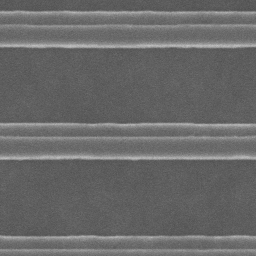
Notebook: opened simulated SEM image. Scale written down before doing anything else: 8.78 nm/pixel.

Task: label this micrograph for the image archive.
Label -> lines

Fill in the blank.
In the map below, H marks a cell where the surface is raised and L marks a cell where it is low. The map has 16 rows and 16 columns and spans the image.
LLLLLLLLLLLLLLLL
HHHHHHHHHHHHHHHH
HHHHHHHHHHHHHHHH
LLLLLLLLLLLLLLLL
LLLLLLLLLLLLLLLL
LLLLLLLLLLLLLLLL
LLLLLLLLLLLLLLLL
LLLLLLLLLLLLLLLL
HHHHHHHHHHHHHHHH
HHHHHHHHHHHHHHHH
LLLLLLLLLLLLLLLL
LLLLLLLLLLLLLLLL
LLLLLLLLLLLLLLLL
LLLLLLLLLLLLLLLL
LLLLLLLLLLLLLLLL
HHHHHHHHHHHHHHHH